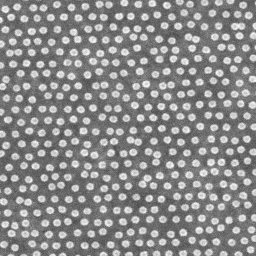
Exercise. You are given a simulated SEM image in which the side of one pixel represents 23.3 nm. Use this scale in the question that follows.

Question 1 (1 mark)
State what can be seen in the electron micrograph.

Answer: a regular array of raised bodies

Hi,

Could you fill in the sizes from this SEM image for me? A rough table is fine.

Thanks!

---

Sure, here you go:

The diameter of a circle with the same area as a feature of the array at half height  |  144 nanometers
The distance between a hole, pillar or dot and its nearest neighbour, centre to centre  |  260 nanometers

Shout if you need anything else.